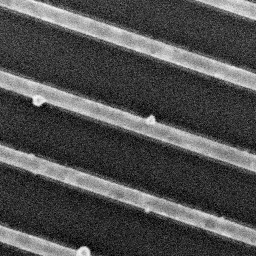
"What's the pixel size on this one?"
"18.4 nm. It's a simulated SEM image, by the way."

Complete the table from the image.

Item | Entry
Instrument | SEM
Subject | lines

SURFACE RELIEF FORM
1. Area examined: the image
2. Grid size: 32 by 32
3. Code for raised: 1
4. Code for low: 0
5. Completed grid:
11111000000000000000000000111111
00011111000000000000000000000111
00000111111000000000000000000000
00000000011111100000000000000000
00000000000011111100000000000000
00000000000000011111100000000000
00000000000000000011111100000000
00000000000000000000011111100000
00000000000000000000000011111100
11000000000000000000000000011111
11111000000000000000000000000011
00111111000000000000000000000000
00001111111000000000000000000000
00000000111111000000000000000000
00000000000111111000000000000000
00000000000000111111000000000000
00000000000000000111111000000000
00000000000000000000111111000000
10000000000000000000000111111000
11110000000000000000000000111111
01111110000000000000000000000111
00001111110000000000000000000000
00000001111110000000000000000000
00000000001111110000000000000000
00000000000001111110000000000000
00000000000000000111110000000000
00000000000000000000111110000000
00000000000000000000000111110000
10000000000000000000000001111110
11110000000000000000000000001111
01111110000000000000000000000001
00001111111000000000000000000000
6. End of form